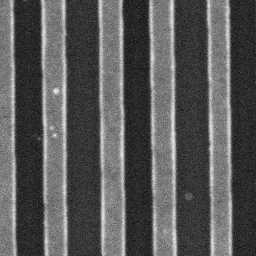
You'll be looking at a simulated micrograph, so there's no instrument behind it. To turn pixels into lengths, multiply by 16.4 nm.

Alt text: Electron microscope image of lines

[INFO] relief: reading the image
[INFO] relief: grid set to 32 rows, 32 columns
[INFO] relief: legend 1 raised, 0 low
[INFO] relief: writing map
11000111000011100001110000111000
11000111000011100001110000111000
11000111000011100001110000111000
11000111000011100001110000111000
11000111000001100001110000111000
11000111000001100001110000111000
11000111000001100001110000111000
11000111000001100001110000111000
11000111000001100001110000111000
11000111000001100001110000111000
11000111000001100001110000111000
11000111000001100001110000111000
11000111000001100001110000111000
11000111000001100001110000111000
11000111000001100001110000111000
11000111000001100001110000111000
11000011000001100001110000111000
11000011000001100001110000111000
11000011000001100001110000111000
11000011000001100001110000111000
11000011000001100001110000111000
11000011000001100001110000111000
11000011000001100001110000111000
11000011000001100001110000111000
11000011000001110001110000111000
11000011000001110001110000111000
11000011000001110001110000111000
11000011000001110001110000111000
11000011000001110001110000111000
11000011000001110001110000111000
11000011000001110001110000111000
11000011000001110001110000111000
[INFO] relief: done